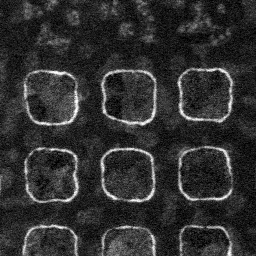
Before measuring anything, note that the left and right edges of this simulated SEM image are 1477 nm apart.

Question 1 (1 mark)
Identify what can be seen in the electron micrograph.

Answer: raised bodies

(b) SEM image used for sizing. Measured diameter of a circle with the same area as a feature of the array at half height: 0.323 micrometres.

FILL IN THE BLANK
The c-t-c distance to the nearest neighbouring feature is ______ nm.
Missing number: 444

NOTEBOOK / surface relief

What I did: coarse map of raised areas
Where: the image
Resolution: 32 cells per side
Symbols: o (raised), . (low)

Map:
................................
................................
................................
................................
................................
................................
................................
................................
................................
...oooooo....oooooo....oooooo...
...ooooooo...oooooo...ooooooo...
...ooooooo...oooooo....oooooo...
...ooooooo...oooooo....oooooo...
...ooooooo...oooooo...ooooooo...
....ooooo....oooooo....ooooo....
......o..........o..............
................................
................................
.........................o......
....ooooo....oooooo....ooooo....
...ooooooo...oooooo...ooooooo...
...oooooo....oooooo...ooooooo...
...ooooooo...oooooo...ooooooo...
...ooooooo...oooooo....oooooo...
....ooooo.....ooooo....ooooo....
................................
................................
................................
....oooo......oooo.....ooooo....
...oooooo....oooooo....ooooo....
...ooooooo...oooooo....oooooo...
...oooooo....oooooo....oooooo...